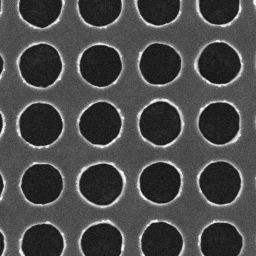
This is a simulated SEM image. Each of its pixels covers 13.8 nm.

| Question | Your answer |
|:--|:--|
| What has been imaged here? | a regular array of holes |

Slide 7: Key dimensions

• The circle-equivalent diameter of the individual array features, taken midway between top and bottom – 0.588 um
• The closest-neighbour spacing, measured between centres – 0.811 micrometres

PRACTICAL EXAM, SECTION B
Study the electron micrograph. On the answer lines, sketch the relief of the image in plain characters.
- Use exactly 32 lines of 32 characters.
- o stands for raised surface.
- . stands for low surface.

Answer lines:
oo......oo.....oo......oo.....oo
oo......oo.....oo.....ooo.....oo
ooo....ooo....oooo....oooo...ooo
oooooooooooooooooooooooooooooooo
oooooooooooooooooooooooooooooooo
ooooo.ooooooooooooo.oooooo..oooo
ooo....oooo....ooo....ooo.....oo
oo......oo.....ooo.....oo.....oo
oo......oo.....oo......oo.....oo
ooo....ooo.....ooo....ooo.....oo
oooo...oooo...ooooo..oooooo.oooo
oooooooooooooooooooooooooooooooo
oooooooooooooooooooooooooooooooo
ooo....oooo...oooo....oooo...ooo
ooo.....oo.....ooo....ooo.....oo
oo......oo.....oo......oo.....oo
oo......oo.....ooo.....oo.....oo
ooo....oooo...oooo....oooo...ooo
oooooooooooooooooooooooooooooooo
oooooooooooooooooooooooooooooooo
ooooo.oooooo..ooooo..ooooo...ooo
ooo....ooo.....ooo....ooo.....oo
ooo.....oo.....oo......oo.....oo
ooo.....oo.....ooo.....oo.....oo
ooo....ooo.....ooo....oooo....oo
oooooooooooo..ooooooooooooo.oooo
oooooooooooooooooooooooooooooooo
oooooooooooooooooooooooooooooooo
oooo...oooo....ooo....oooo...ooo
ooo.....oo.....ooo.....oo.....oo
.oo.....oo.....ooo.....oo.....oo
ooo.....oo.....ooo.....oo.....oo